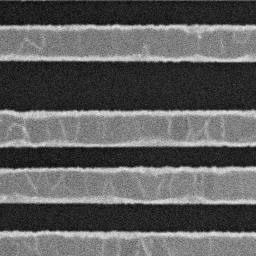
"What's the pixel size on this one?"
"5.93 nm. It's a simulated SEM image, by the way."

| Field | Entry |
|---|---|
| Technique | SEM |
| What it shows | lines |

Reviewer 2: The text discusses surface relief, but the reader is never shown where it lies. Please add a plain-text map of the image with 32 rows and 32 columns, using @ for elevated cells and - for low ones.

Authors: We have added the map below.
--------------------------------
--------------------------------
--------------------------------
@@@@@@@@@@@@@@@@@@@@@@@@@@@@@@@@
@@@@@@@@@@@@@@@@@@@@@@@@@@@@@@@@
@@@@@@@@@@@@@@@@@@@@@@@@@@@@@@@@
@@@@@@@@@@@@@@@@@@@@@@@@@@@@@@@@
----------------------@---@@@@--
--------------------------------
--------------------------------
--------------------------------
--------------------------------
--------------------------------
--------------------------------
@@@@@@@@@@@@@@@@@@@@@@@@@@@@@@@@
@@@@@@@@@@@@@@@@@@@@@@@@@@@@@@@@
@@@@@@@@@@@@@@@@@@@@@@@@@@@@@@@@
@@@@@@@@@@@@@@@@@@@@@@@@@@@@@@@@
--------------------------------
--------------------------------
--------------------------------
@@@@@@@@@@@@@@@@@@@@@@@@@@@@@@@@
@@@@@@@@@@@@@@@@@@@@@@@@@@@@@@@@
@@@@@@@@@@@@@@@@@@@@@@@@@@@@@@@@
@@@@@@@@@@@@@@@@@@@@@@@@@@@@@@@@
--------------------------------
--------------------------------
--------------------------------
--------------------------------
@@@@@@@@@@@@@@@@@@@@@@@@@@@@@@@@
@@@@@@@@@@@@@@@@@@@@@@@@@@@@@@@@
@@@@@@@@@@@@@@@@@@@@@@@@@@@@@@@@